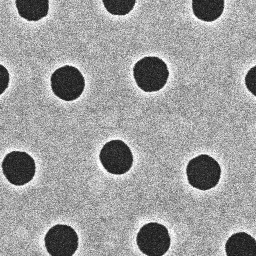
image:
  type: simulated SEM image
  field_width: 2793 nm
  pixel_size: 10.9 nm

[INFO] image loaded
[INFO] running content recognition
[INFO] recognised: holes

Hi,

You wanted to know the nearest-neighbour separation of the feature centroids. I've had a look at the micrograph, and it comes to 966 nm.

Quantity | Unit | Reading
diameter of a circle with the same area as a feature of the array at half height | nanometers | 384